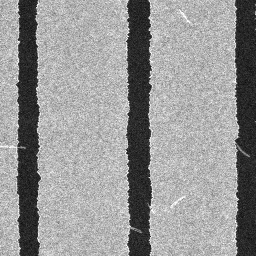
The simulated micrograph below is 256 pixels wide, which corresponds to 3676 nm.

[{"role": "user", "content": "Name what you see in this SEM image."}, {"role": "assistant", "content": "one or a few lines or trenches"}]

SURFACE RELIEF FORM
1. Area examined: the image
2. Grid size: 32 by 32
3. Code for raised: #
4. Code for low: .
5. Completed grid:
##...###########...##########...
##...###########...##########...
##...###########...##########...
##...###########...##########...
##...###########...##########...
##...###########...##########...
##...###########...##########...
##...###########...##########...
##...###########...##########...
##...###########...###########..
##...###########...##########...
##...###########...##########...
##...###########...##########...
##...###########...###########..
##...###########...###########..
##...###########...###########..
##...###########...###########..
##...###########...##########...
##...###########...##########...
##...###########...##########...
##...###########...##########...
##...###########...###########..
##...###########...###########..
##...###########...###########..
##...###########...###########..
##...###########...###########..
##...###########...###########..
##...###########...##########...
##...###########...###########..
##...###########...##########...
##...###########...##########...
##...###########...###########..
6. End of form